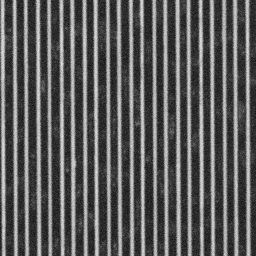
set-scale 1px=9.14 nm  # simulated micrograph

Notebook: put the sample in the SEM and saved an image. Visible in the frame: parallel lines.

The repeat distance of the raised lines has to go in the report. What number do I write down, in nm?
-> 107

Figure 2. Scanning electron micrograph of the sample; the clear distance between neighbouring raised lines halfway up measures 89.1 nanometers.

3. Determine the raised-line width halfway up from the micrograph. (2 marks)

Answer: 17.1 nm